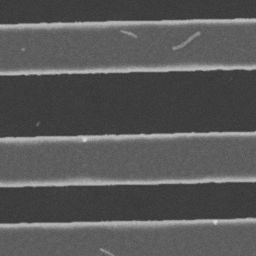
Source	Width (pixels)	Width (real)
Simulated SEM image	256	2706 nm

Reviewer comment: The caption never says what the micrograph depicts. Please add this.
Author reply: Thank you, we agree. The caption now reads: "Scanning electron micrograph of lines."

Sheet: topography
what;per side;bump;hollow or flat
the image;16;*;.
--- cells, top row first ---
................
...*************
****************
****************
********........
................
................
................
......**********
****************
****************
**********......
................
................
****************
****************